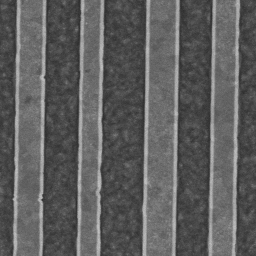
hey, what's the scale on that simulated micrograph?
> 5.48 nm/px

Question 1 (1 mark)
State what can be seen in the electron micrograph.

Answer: one or a few lines or trenches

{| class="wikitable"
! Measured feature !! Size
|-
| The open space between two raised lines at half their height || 207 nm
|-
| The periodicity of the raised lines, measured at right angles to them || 355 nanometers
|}